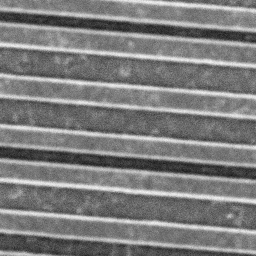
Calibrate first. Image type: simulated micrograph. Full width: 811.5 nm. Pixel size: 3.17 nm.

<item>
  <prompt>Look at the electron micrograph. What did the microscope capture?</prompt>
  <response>parallel lines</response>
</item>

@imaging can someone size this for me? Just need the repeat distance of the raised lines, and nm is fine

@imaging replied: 144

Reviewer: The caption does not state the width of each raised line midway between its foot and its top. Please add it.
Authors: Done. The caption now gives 21.1 pixels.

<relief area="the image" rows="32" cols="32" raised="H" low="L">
HHHHHHHHHHHHHHHHHHHHHHLLLLLLLLLL
LLLHHHHHHHHHHHHHHHHHHHHHHHHHHHHH
LLLLLLLLLLLLLLLLLHHHHHHHHHHHHHHH
HHHHHHHLLLLLLLLLLLLLLLLLLLLHHHHH
HHHHHHHHHHHHHHHHHHHLLLLLLLLLLLLL
HHHHHHHHHHHHHHHHHHHHHHHHHHHHHHHL
LLLLLLLLLLHHHHHHHHHHHHHHHHHHHHHH
LLLLLLLLLLLLLLLLLLLLLLHHHHHHHHHH
LLLLLLLLLLLLLLLLLLLLLLLLLLLLLLLL
HLLLLLLLLLLLLLLLLLLLLLLLLLLLLLLL
HHHHHHHHHHHHHLLLLLLLLLLLLLLLLLLL
HHHHHHHHHHHHHHHHHHHHHHHHHLLLLLLL
LLLLLLHHHHHHHHHHHHHHHHHHHHHHHHHH
LLLLLLLLLLLLLLLLLLHHHHHHHHHHHHHH
LLLLLLLLLLLLLLLLLLLLLLLLLLLLLHHH
LLLLLLLLLLLLLLLLLLLLLLLLLLLLLLLL
HHHHHHHHHLLLLLLLLLLLLLLLLLLLLLLL
HHHHHHHHHHHHHHHHHHHHHLLLLLLLLLLL
LLLLLHHHHHHHHHHHHHHHHHHHHHHHHHHH
LLLLLLLLLLLLLLLLHHHHHHHHHHHHHHHH
HHHHHHLLLLLLLLLLLLLLLLLLLLLLHHHH
HHHHHHHHHHHHHHHHHHLLLLLLLLLLLLLL
HHHHHHHHHHHHHHHHHHHHHHHHHHHHHHLL
LLLLLLLLLLLLLHHHHHHHHHHHHHHHHHHH
LLLLLLLLLLLLLLLLLLLLLLLHLHHHHHHH
LLLLLLLLLLLLLLLLLLLLLLLLLLLLLLLL
HHLLLLLLLLLLLLLLLLLLLLLLLLLLLLLL
HHHHHHHHHHHHHLLLLLLLLLLLLLLLLLLL
HHHHHHHHHHHHHHHHHHHHHHHHHLLLLLLL
LLLLLLLHHHHHHHHHHHHHHHHHHHHHHHHH
LLLLLLLLLLLLLLLLLLHHHHHHHHHHHHHH
LLLLLLLLLLLLLLLLLLLLLLLLLLLLLLHH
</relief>